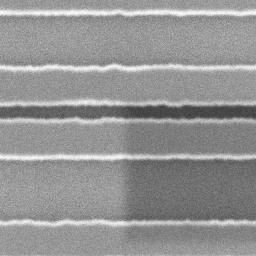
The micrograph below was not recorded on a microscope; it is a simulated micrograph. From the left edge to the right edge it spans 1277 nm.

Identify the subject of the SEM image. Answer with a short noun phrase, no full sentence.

lines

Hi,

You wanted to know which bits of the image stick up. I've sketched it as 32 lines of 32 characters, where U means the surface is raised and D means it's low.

UUUUUUUUUUUUUUUUUUUUUUUUUUUUUUUU
UUUUUUUUUUUUUUUUUUUUUUUUUUUUUUUU
DDDDDDDDDDDDDDDDDDDDDDDDDDDDDDDD
DDDDDDDDDDDDDDDDDDDDDDDDDDDDDDDD
DDDDDDDDDDDDDDDDDDDDDDDDDDDDDDDD
DDDDDDDDDDDDDDDDDDDDDDDDDDDDDDDD
DDDDDDDDDDDDDDDDDDDDDDDDDDDDDDDD
DDDDDDDDDDDDDDDDDDDDDDDDDDDDDDDD
UUUUUUUUUUUUUUUUUUUUUUUUUUUUUUUU
UUUUUUUUUUUUUUUUUUUUUUUUUUUUUUUU
UUUUUUUUUUUUUUUUUUUUUUUUUUUUUUUU
UUUUUUUUUUUUUUUUUUUUUUUUUUUUUUUU
UUUUUUUUUUUUUUUUUUUUUUUUUUUUUUUU
DDDDDDDDDDDDDDDDDDDDDDDDDDDDDDDD
DDDDDDDDDDDDDDDDDDDDDDDDDDDDDDDD
UUUUUUUUUUUUUUUUUUUUUUUUUUUUUUUU
UUUUUUUUUUUUUUUUUUUUUUUUUUUUUUUU
UUUUUUUUUUUUUUUUUUUUUUUUUUUUUUUU
UUUUUUUUUUUUUUUUUUUUUUUUUUUUUUUU
UUUUUUUUUUUUUUUUUUUUUUUUUUUUUUUU
DDDDDDDDDDDDDDDDDDDDDDDDDDDDDDDD
DDDDDDDDDDDDDDDDDDDDDDDDDDDDDDDD
DDDDDDDDDDDDDDDDDDDDDDDDDDDDDDDD
DDDDDDDDDDDDDDDDDDDDDDDDDDDDDDDD
DDDDDDDDDDDDDDDDDDDDDDDDDDDDDDDD
DDDDDDDDDDDDDDDDDDDDDDDDDDDDDDDD
DDDDDDDDDDDDDDDDDDDDDDDDDDDDDDDD
DDDDDDDDDDDDDDDDDDDDDDDDDDDDDDDD
UUUUUUUUUUUUUUUUUUUUUUUUUUUUUUUU
UUUUUUUUUUUUUUUUUUUUUUUUUUUUUUUU
UUUUUUUUUUUUUUUUUUUUUUUUUUUUUUUU
UUUUUUUUUUUUUUUUUUUUUUUUUUUUUUUU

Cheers